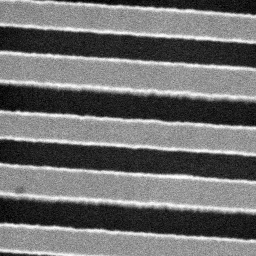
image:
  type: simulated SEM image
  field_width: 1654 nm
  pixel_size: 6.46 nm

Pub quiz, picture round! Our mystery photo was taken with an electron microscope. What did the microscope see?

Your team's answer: lines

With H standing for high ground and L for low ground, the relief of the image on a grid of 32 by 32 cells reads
HHHHHHHHHHHLLLLLLLLLLLLLLLLLLLLL
HHHHHHHHHHHHHHHHHHHHHHHHHHLLLLLL
HHHHHHHHHHHHHHHHHHHHHHHHHHHHHHHH
LLLLLHHHHHHHHHHHHHHHHHHHHHHHHHHH
LLLLLLLLLLLLLLLLLLLLHHHHHHHHHHHH
LLLLLLLLLLLLLLLLLLLLLLLLLLLLLLLL
HLLLLLLLLLLLLLLLLLLLLLLLLLLLLLLL
HHHHHHHHHHHHHHHHLLLLLLLLLLLLLLLL
HHHHHHHHHHHHHHHHHHHHHHHHHHHHHHHH
HHHHHHHHHHHHHHHHHHHHHHHHHHHHHHHH
LLLLHHHHHHHHHHHHHHHHHHHHHHHHHHHH
LLLLLLLLLLLLLLLLLLLLHHHHHHHHHHHH
LLLLLLLLLLLLLLLLLLLLLLLLLLLLLLLL
LLLLLLLLLLLLLLLLLLLLLLLLLLLLLLLL
HHHHHHHHHHLLLLLLLLLLLLLLLLLLLLLL
HHHHHHHHHHHHHHHHHHHHHHHHLLLLLLLL
HHHHHHHHHHHHHHHHHHHHHHHHHHHHHHHH
LLLHHHHHHHHHHHHHHHHHHHHHHHHHHHHH
LLLLLLLLLLLLLLLLLLHHHHHHHHHHHHHH
LLLLLLLLLLLLLLLLLLLLLLLLLLLLLLLL
LLLLLLLLLLLLLLLLLLLLLLLLLLLLLLLL
HHHHHHHHHHHHHHLLLLLLLLLLLLLLLLLL
HHHHHHHHHHHHHHHHHHHHHHHHHHHHLLLL
HHHHHHHHHHHHHHHHHHHHHHHHHHHHHHHH
LLLLHHHHHHHHHHHHHHHHHHHHHHHHHHHH
LLLLLLLLLLLLLLLLLLLLHHHHHHHHHHHH
LLLLLLLLLLLLLLLLLLLLLLLLLLLLLLLL
LLLLLLLLLLLLLLLLLLLLLLLLLLLLLLLL
HHHHHHHHHLLLLLLLLLLLLLLLLLLLLLLL
HHHHHHHHHHHHHHHHHHHHHHLLLLLLLLLL
HHHHHHHHHHHHHHHHHHHHHHHHHHHHHHHH
LLHHHHHHHHHHHHHHHHHHHHHHHHHHHHHH